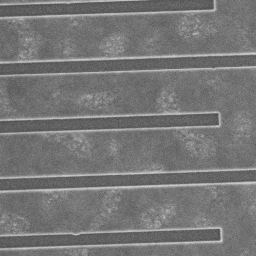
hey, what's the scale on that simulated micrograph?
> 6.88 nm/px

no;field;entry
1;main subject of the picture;parallel lines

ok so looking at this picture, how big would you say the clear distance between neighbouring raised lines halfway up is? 81.7 nm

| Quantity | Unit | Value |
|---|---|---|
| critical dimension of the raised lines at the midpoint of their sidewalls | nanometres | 314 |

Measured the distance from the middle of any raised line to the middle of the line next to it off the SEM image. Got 397 nm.